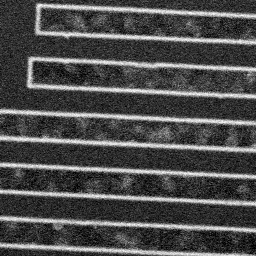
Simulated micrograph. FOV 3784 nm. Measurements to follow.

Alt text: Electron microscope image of parallel lines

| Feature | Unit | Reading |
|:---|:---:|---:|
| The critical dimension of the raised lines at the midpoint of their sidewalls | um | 0.399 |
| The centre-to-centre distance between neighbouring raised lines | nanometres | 792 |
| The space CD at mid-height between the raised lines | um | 0.386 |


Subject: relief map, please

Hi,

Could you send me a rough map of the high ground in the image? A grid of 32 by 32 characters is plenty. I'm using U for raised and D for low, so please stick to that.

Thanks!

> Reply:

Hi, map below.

UUUUUUUUUUUUUUUUUUUUUUUUUUUUUUUU
UUUUUDDDDDDDDDDDDDDDDUUUUUUUUUUU
UUUUUDDDDDDDDDDDDDDDDDDDDDDDDDDD
UUUUUDDDDDDDDDDDDDDDDDDDDDDDDDDD
UUUUUUUUUUUUUDDDDDDDDDDDDDDDDDDD
UUUUUUUUUUUUUUUUUUUUUUUUUUUUUUUU
UUUUUUUUUUUUUUUUUUUUUUUUUUUUUUUU
UUUUDDDUUUUUUUUUUUUUUUUUUUUUUUUU
UUUUDDDDDDDDDDDDDDDDDDDDDDDDUUUU
UUUUDDDDDDDDDDDDDDDDDDDDDDDDDDDD
UUUUDDDDDDDDDDDDDDDDDDDDDDDDDDDD
UUUUUUUUUUUUUUUUUUUDDDDDDDDDDDDD
UUUUUUUUUUUUUUUUUUUUUUUUUUUUUUUU
UUUUUUUUUUUUUUUUUUUUUUUUUUUUUUUU
DDDDDDDDDDDDDUUUUUUUUUUUUUUUUUUU
DDDDDDDDDDDDDDDDDDDDDDDDDDDDDDDD
DDDDDDDDDDDDDDDDDDDDDDDDDDDDDDDD
UUUUUDDDDDDDDDDDDDDDDDDDDDDDDDDD
UUUUUUUUUUUUUUUUUUUUUUUUUUDDDDDD
UUUUUUUUUUUUUUUUUUUUUUUUUUUUUUUU
UUUUUUUUUUUUUUUUUUUUUUUUUUUUUUUU
DDDDDDDDDDDDDDDDDDDDUUUUUUUUUUUU
DDDDDDDDDDDDDDDDDDDDDDDDDDDDDDDD
DDDDDDDDDDDDDDDDDDDDDDDDDDDDDDDD
UUUUUUUUUUDDDDDDDDDDDDDDDDDDDDDD
UUUUUUUUUUUUUUUUUUUUUUUUUUUUUUUU
UUUUUUUUUUUUUUUUUUUUUUUUUUUUUUUU
DDDDUUUUUUUUUUUUUUUUUUUUUUUUUUUU
DDDDDDDDDDDDDDDDDDDDDDDDDUUUUUUU
DDDDDDDDDDDDDDDDDDDDDDDDDDDDDDDD
DDDDDDDDDDDDDDDDDDDDDDDDDDDDDDDD
UUUUUUUUUUUUUUUUUUDDDDDDDDDDDDDD